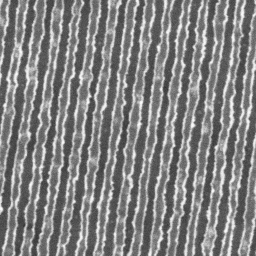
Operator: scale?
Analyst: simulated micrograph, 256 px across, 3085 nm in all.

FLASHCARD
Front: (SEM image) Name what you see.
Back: parallel lines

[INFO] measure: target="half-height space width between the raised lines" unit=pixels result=9.29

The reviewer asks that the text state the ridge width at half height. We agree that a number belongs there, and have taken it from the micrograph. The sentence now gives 103 nm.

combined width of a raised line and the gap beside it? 217 nm